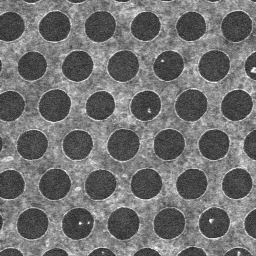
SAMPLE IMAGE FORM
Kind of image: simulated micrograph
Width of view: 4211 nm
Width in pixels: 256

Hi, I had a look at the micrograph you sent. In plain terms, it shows a regular array of holes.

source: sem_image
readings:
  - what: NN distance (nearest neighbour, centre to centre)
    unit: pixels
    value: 45.2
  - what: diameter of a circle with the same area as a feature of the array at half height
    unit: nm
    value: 528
